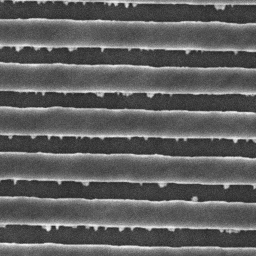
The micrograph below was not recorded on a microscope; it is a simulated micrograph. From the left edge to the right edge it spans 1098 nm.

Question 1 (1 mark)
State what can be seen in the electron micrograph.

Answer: lines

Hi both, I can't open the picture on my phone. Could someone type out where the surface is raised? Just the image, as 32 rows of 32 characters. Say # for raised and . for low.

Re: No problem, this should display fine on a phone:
.......................#########
................................
#########...#...................
################################
################################
################################
................................
................................
###################.####........
################################
################################
.......#########################
................................
##....##........................
################################
################################
################################
................................
................................
#####################...........
################################
################################
...#############################
................................
................................
################################
################################
################################
.......................#########
................................
##...##.........................
################################